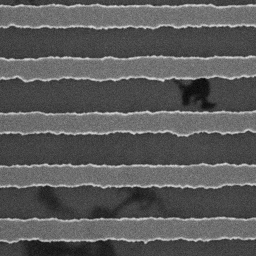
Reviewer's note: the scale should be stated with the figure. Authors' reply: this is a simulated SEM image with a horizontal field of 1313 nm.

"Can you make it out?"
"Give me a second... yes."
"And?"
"lines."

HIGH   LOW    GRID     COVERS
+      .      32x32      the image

................................
++++++++++++++++++++++++++++++++
++++++++++++++++++++++++++++++++
............++..................
................................
................................
................................
++.+++++++++++++++++++++++++++++
++++++++++++++++++++++++++++++++
++++++++++++++++++++++++++++++++
................................
................................
................................
................................
++++++++++++++++++++++++++++++++
++++++++++++++++++++++++++++++++
+++++++++++++++++++++++++++++++.
................................
................................
................................
................................
++++++++++++++++++++++++++++++++
++++++++++++++++++++++++++++++++
................................
................................
................................
................................
+++++++...++++++++++++++++++++++
++++++++++++++++++++++++++++++++
++++++++++++++++++++++++++++++++
................................
................................